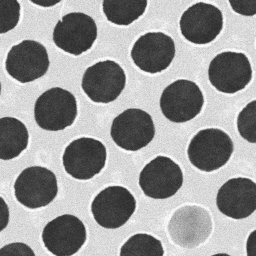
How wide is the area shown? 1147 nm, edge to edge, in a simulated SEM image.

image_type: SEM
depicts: a regular array of holes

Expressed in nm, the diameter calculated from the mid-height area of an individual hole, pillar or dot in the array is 191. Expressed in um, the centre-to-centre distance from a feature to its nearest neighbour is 0.25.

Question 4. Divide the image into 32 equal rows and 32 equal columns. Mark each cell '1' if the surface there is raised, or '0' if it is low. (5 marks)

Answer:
00111001111110000011111100111000
00111111111110000011111000001000
00111111000011000111111000001111
00111110000011111111111000001111
11111110000011111100011000011111
11000110000011111000001111111111
10000011001111110000001111110111
10000011111111111000001111100001
10000011111000011000011111000001
10000111111000001111111111000001
11111111110000001111100011000001
11111100011000011111000001110011
11111000011100111111000001111111
11110000001111111111000001111110
11110000011111100001100011111100
00011000011111000001111111111100
00011111111111000001111110001100
00001111110011000001111100000110
00011111000001100011111100000111
00111111000001111111111100000111
11111111000001111100001100001111
11100011000011111100000111111111
11000001111111111000000111111001
11000001111110001100001111110000
11000001111100000110011111100000
01100011111000000111111111100000
01111111111000000111111111110000
01111110001100001111111111111111
01111100000110011111111111111111
11111000000111111001111111111110
10011100001111110000111111111110
00001100001111100000111111111110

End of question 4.